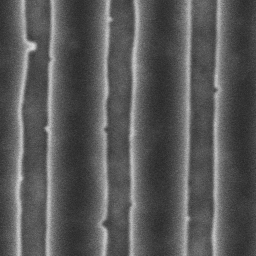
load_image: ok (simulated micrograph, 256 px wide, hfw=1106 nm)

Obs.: one or a few lines or trenches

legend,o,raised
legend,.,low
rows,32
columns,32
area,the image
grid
ooo...oooooooo...ooooooo...ooooo
ooo....oooooo....ooooooo...ooooo
ooo...oooooooo...ooooooo...ooooo
ooo...ooooooo....ooooooo...ooooo
ooo...ooooooo....ooooooo...ooooo
oooo..ooooooo....ooooooo...ooooo
oooo..ooooooo....ooooooo...ooooo
ooo...ooooooo....ooooooo...ooooo
ooo...ooooooo....ooooooo...ooooo
ooo...ooooooo....ooooooo...ooooo
ooo...ooooooo....ooooooo...ooooo
ooo...ooooooo....ooooooo...ooooo
ooo...ooooooo....ooooooo...ooooo
ooo...ooooooo....ooooooo...ooooo
ooo...ooooooo....ooooooo...ooooo
ooo...ooooooo...oooooooo...ooooo
ooo...ooooooo...oooooooo...ooooo
ooo...ooooooo...oooooooo...ooooo
ooo...ooooooo...oooooooo...ooooo
ooo...ooooooo...oooooooo...ooooo
oo....ooooooo...oooooooo...ooooo
oo....ooooooo....oooooo....ooooo
ooo...ooooooo...ooooooo....ooooo
oo....ooooooo...ooooooo....ooooo
oo....ooooooo...ooooooo....ooooo
oo....ooooooo...ooooooo....ooooo
oo....ooooooo...ooooooo....ooooo
oo....ooooooo...ooooooo....ooooo
oo....ooooooo...ooooooo....ooooo
oo....ooooooo...ooooooo....ooooo
oo....ooooooo...ooooooo....ooooo
ooo...ooooooo...ooooooo....ooooo